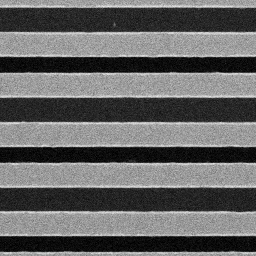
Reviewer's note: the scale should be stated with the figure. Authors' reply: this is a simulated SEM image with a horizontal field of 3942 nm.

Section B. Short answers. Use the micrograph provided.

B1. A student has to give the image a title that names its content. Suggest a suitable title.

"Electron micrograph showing lines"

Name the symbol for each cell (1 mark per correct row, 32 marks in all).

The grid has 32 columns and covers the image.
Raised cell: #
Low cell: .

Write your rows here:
################################
................................
................................
................................
################################
################################
################################
................................
................................
################################
################################
################################
................................
................................
................................
################################
################################
################################
................................
................................
################################
################################
################################
................................
................................
................................
################################
################################
################################
..................##...#........
................................
..##...##.#............#...###..